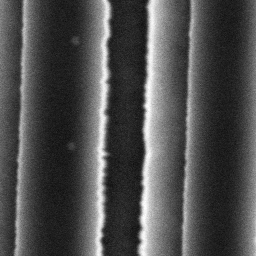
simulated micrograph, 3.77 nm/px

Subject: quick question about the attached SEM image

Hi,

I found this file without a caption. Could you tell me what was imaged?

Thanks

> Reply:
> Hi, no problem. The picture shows lines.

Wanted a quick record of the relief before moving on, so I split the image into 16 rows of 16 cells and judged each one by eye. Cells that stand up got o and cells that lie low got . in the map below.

ooooooo..ooooooo
ooooooo..ooooooo
ooooooo..ooooooo
ooooooo..ooooooo
ooooooo..ooooooo
ooooooo..ooooooo
oooooo...ooooooo
oooooo...ooooooo
oooooo...ooooooo
oooooo...ooooooo
oooooo...ooooooo
oooooo...ooooooo
oooooo...ooooooo
oooooo...ooooooo
oooooo...ooooooo
oooooo...ooooooo